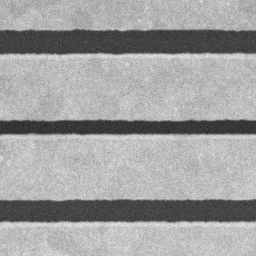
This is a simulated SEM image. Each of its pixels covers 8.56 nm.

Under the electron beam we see lines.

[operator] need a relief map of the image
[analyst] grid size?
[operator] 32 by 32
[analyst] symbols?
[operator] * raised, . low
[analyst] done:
********************************
********************************
********************************
********************************
................................
................................
................................
********************************
********************************
********************************
********************************
********************************
********************************
********************************
********************************
................................
................................
********************************
********************************
********************************
********************************
********************************
********************************
********************************
********************************
................................
................................
................................
********************************
********************************
********************************
********************************